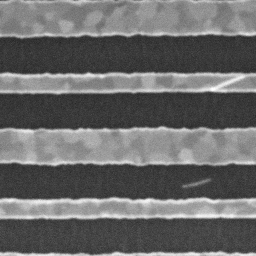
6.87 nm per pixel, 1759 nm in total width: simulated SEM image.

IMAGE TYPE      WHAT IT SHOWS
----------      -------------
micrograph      lines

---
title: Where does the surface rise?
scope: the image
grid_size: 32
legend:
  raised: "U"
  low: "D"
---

UUUUUUUUUUUUUUUUUUUUUUUUUUUUUUUU
UUUUUUUUUUUUUUUUUUUUUUUUUUUUUUUU
UUUUUUUUUUUUUUUUUUUUUUUUUUUUUUUU
UUUUUUUUUUUUUUUUUUUUUUUUUUUUUUUU
DDUUDDDDUDDDDDDDDDDDDDDDDDDDDDDD
DDDDDDDDDDDDDDDDDDDDDDDDDDDDDDDD
DDDDDDDDDDDDDDDDDDDDDDDDDDDDDDDD
DDDDDDDDDDDDDDDDDDDDDDDDDDDDDDDD
DDDDDDDDDDDDDDDDDDDDDDDDDDDDDDDD
UUUUUUUUUUUUUUUUUUUUUUUUUUUUUUUU
UUUUUUUUUUUUUUUUUUUUUUUUUUUUUUUU
UUUUUUUUUUUUUUUDDDDDDDDDDDDDDDDD
DDDDDDDDDDDDDDDDDDDDDDDDDDDDDDDD
DDDDDDDDDDDDDDDDDDDDDDDDDDDDDDDD
DDDDDDDDDDDDDDDDDDDDDDDDDDDDDDDD
DDDDDDDDDDDDDDDDDDDDDDDDDDDDDDDD
UUUUUUUUUUUUUUUUUUUUUUUUUUUUUUUU
UUUUUUUUUUUUUUUUUUUUUUUUUUUUUUUU
UUUUUUUUUUUUUUUUUUUUUUUUUUUUUUUU
UUUUUUUUUUUUUUUUUUUUUUUUUUUUUUUU
DDDDUUUUDDDDUDDDDUUDUDDDUUUUDDDD
DDDDDDDDDDDDDDDDDDDDDDDDDDDDDDDD
DDDDDDDDDDDDDDDDDDDDDDDDDDDDDDDD
DDDDDDDDDDDDDDDDDDDDDDDDDDDDDDDD
DDDDDDDDDDDDDDDDDDDDDDDDDDDDDDDD
UUUUUUUUUUUUUUUUUUUUUUUUUUUUUUUU
UUUUUUUUUUUUUUUUUUUUUUUUUUUUUUUU
DDDDDDDDDDDDDDDDDDDDDDDDDDDDDDDD
DDDDDDDDDDDDDDDDDDDDDDDDDDDDDDDD
DDDDDDDDDDDDDDDDDDDDDDDDDDDDDDDD
DDDDDDDDDDDDDDDDDDDDDDDDDDDDDDDD
DDDDDDDDDDDDDDDDDDDDDDDDDDDDDDDD